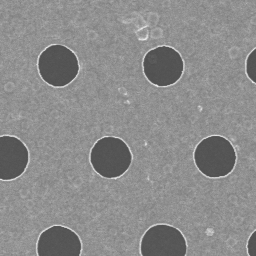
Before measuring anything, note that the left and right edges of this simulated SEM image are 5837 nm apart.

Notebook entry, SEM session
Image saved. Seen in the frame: holes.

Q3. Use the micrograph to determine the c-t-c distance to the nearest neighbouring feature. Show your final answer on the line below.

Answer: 2.39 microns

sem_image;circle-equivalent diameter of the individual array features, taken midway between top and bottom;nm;935